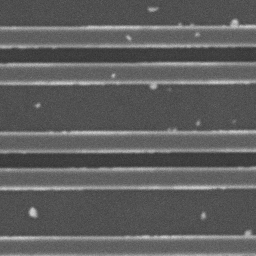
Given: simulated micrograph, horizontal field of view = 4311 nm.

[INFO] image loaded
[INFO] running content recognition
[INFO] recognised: lines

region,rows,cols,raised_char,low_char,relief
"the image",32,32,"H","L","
LLLLLLLLLLLLLLLLLLLLLLLLLLLLLLLL
LLLLLLLLLLLLLLLLLLLLLLLLLLLLLLLL
LLLLLLLLLLLLLLLLLLLLLLLLLLLLLLLL
HHHHHHHHHHHHHHHHHHHHHHHHHHHHHHHH
HHHHHHHHHHHHHHHHHHHHHHHHHHHHHHHH
HHHHHHHHHHHHHHHHHHHHHHHHHHHHHHHH
LLLLLLLLLLLLLLLLLLLLLLLLLLLLLLLL
LLLLLLLLLLLLLLLLLLLLLLLLLLLLLLLL
HHHHHHHHHHHHHHHHHHHHHHHHHHHHHHHH
HHHHHHHHHHHHHHHHHHHHHHHHHHHHHHHH
LLLLLLLLLLLLLLLLLLLLLLLLLLLLLLLL
LLLLLLLLLLLLLLLLLLLLLLLLLLLLLLLL
LLLLLLLLLLLLLLLLLLLLLLLLLLLLLLLL
LLLLLLLLLLLLLLLLLLLLLLLLLLLLLLLL
LLLLLLLLLLLLLLLLLLLLLLLLLLLLLLLL
LLLLLLLLLLLLLLLLLLLLLLLLLLLLLLLL
LLLLLLLLLLLLLLLLLLLLLLLLLLHHHHHH
HHHHHHHHHHHHHHHHHHHHHHHHHHHHHHHH
HHHHHHHHHHHHHHHHHHHHHHHHHHHHHHHH
LLLLLLLLLLLLLLLLLLLLLLLLLLLLLLLL
LLLLLLLLLLLLLLLLLLLLLLLLLLLLLLLL
HHHHHHHHHHHHHHHHHHHHHHHHHHHHHHHH
HHHHHHHHHHHHHHHHHHHHHHHHHHHHHHHH
HHHHHHHHHHHHHHHHHHHHHHHHHHHLLLLL
LLLLLLLLLLLLLLLLLLLLLLLLLLLLLLLL
LLLLLLLLLLLLLLLLLLLLLLLLLLLLLLLL
LLLLLLLLLLLLLLLLLLLLLLLLLLLLLLLL
LLLLLLLLLLLLLLLLLLLLLLLLLLLLLLLL
LLLLLLLLLLLLLLLLLLLLLLLLLLLLLLLL
LLLLLLLLLLLLLLLLLLLLLLLLLLLLLLLL
HHHHHHHHHHHHHHHHHHHHHHHHHHHHHHHH
HHHHHHHHHHHHHHHHHHHHHHHHHHHHHHHH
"